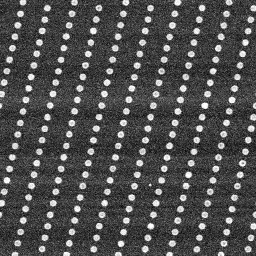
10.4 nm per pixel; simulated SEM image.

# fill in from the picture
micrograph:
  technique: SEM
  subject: a regular array of raised bodies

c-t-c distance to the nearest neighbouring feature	122	nm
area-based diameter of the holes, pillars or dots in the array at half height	0.0609	micrometres